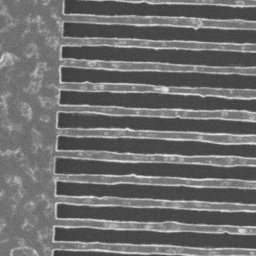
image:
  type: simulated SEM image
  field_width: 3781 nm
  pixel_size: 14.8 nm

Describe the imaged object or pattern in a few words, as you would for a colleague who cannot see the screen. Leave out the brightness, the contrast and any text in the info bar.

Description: parallel lines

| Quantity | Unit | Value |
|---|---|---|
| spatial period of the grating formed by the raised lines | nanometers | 337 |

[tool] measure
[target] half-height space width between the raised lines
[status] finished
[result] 227 nm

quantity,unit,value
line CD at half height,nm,114